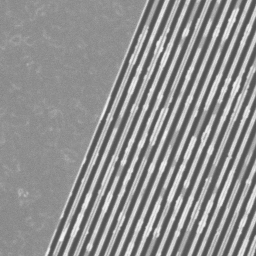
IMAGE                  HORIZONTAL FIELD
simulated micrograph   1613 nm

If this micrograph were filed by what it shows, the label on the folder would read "parallel lines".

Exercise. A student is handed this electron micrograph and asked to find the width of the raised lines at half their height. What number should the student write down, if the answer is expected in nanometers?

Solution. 30.8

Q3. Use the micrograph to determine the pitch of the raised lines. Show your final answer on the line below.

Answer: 60.3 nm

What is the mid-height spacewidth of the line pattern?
30.8 nanometers